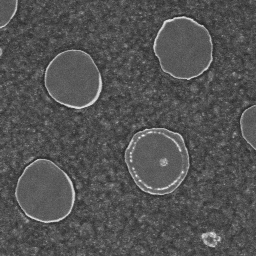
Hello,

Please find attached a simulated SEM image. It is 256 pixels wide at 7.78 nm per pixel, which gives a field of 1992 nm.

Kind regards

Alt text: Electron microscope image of raised bodies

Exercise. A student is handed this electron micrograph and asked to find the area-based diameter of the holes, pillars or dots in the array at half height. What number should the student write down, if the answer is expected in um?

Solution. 0.463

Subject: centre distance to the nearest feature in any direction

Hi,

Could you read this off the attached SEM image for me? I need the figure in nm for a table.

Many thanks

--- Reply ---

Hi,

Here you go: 894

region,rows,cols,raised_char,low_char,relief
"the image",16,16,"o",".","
o...............
..........oo....
..........ooo...
....oo....ooo...
...ooo....ooo...
...ooo..........
....oo..........
...............o
........ooo....o
........oooo....
..oo....oooo....
.ooo.....oo.....
.oooo...........
..oo............
................
................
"